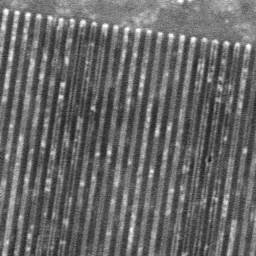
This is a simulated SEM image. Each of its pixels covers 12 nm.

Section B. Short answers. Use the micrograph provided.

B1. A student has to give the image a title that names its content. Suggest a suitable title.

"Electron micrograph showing parallel lines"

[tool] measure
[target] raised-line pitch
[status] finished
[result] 0.134 um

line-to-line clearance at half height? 89.1 nm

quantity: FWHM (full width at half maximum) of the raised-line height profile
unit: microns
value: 0.0446